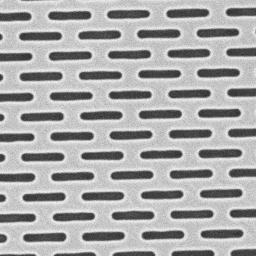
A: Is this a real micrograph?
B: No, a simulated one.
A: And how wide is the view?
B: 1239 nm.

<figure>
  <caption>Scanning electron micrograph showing groups of lines, slits or small figures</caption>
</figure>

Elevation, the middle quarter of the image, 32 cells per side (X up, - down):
XXXXXXXXXXXXXXXXXXXXXXXXXXXXXXXX
XXXXXXXXXXXXXXXXXXXX---------XXX
XXXX----------XXXXX----------XXX
XXXX----------XXXXX---------XXXX
XXXXXXXXXXXXXXXXXXXXXXXXXXXXXXXX
XXXXXXXXXXXXXXXXXXXXXXXXXXXXXXXX
XXXXXXXXXXXXXXXXXXXXXXXXXXX-----
-------XXXX-----------XXXX------
-------XXXX----------XXXXXX-----
XXXXXXXXXXXXXXXXXXXXXXXXXXXXXXXX
XXXXXXXXXXXXXXXXXXXXXXXXXXXXXXXX
XXXXXXXXXXXXXXXXXXXXXXX------XXX
XXXX-----------XXXX----------XXX
XXXX----------XXXXX----------XXX
XXXXXXXXXXXXXXXXXXXXXXXXXXXXXXXX
XXXXXXXXXXXXXXXXXXXXXXXXXXXXXXXX
XXXXXXXXXXXXXXXXXXXXXXXXXXX-----
-------XXXX-----------XXXX------
-------XXXX-----------XXXXX-----
XXXXXXXXXXXXXXXXXXXXXXXXXXXXXXXX
XXXXXXXXXXXXXXXXXXXXXXXXXXXXXXXX
XXXXXXXXXXXXXXXXXXXXX--------XXX
XXXX-----------XXXX-----------XX
XXXX-----------XXXX----------XXX
XXXXXXXXXXXXXXXXXXXXXXXXXXXXXXXX
XXXXXXXXXXXXXXXXXXXXXXXXXXXXXXXX
XXXXXXXXXXXXXXXXXXXX-XXXXXX-----
-------XXXXX----------XXXX------
-------XXXXX----------XXXXX-----
XXXXXXXXXXXXXXXXXXXXXXXXXXXXXXXX
XXXXXXXXXXXXXXXXXXXXXXXXXXXXXXXX
XXXXXXXXXXXXXXXXXXXXXXXXXXXX-XXX